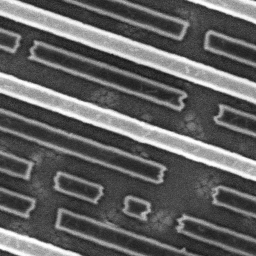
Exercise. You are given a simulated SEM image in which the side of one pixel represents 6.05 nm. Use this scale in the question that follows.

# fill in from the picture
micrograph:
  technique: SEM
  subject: parallel lines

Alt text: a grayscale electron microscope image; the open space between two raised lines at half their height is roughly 122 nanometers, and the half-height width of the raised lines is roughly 94.3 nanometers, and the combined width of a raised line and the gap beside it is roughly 220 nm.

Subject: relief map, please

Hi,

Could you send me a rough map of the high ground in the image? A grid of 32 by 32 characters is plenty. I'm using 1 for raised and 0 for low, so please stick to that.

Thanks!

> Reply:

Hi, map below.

11000000001111110000000000111111
11111000000001111110000000001111
00111111000000001111110000000001
00000011111000000001111000000000
11000000111111000000011000110000
11000000000111111000000000111110
00001111000000111111000000011111
00000111111000000111111000000011
00000000111111000000111111000000
10000000000111111000000111111000
11100000000001111111000001111110
01111100000000001111110000001111
00011111100000000001111000000001
00000001111100000000000000000000
11000000011111100000000000011110
11111000000011111100000000001111
00111111000000011111100000000001
00001111111000000011111100000000
00000001111110000000011111100000
10000000001111110000000011111000
11110000000001111110000000011111
01110000000000001111000000000011
00000001110000000001000000000000
00000001111100000000000000010000
11000000001100000000000000011110
11110000000000001100000000011111
00110000000000001100000000000011
00000001111000000000000100000000
00000000111111000000000111100000
11000000001111111000000011111100
11111000000001111111000000011111
00111111000000001111111000000011